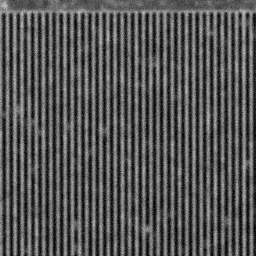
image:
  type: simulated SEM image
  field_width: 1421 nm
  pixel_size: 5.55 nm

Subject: parallel lines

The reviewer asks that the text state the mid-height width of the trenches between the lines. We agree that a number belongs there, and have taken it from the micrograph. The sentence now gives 5.01 pixels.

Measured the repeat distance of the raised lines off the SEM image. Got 39.8 nanometres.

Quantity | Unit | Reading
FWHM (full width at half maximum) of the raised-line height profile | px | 2.13